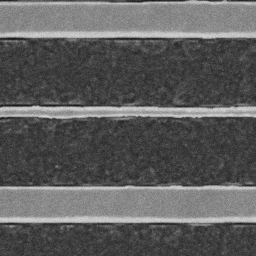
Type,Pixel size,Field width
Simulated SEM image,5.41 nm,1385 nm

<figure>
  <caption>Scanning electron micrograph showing lines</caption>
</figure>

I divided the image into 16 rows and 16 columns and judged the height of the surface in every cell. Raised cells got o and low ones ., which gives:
oooooooooooooooo
oooooooooooooooo
................
................
................
................
................
................
................
................
................
................
oooooooooooooooo
oooooooooooooooo
................
................